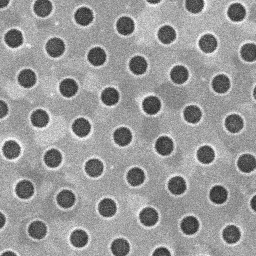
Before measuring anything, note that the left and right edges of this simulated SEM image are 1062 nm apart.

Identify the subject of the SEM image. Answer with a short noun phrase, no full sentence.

a regular array of holes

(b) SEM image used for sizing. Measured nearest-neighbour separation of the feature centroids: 174 nanometres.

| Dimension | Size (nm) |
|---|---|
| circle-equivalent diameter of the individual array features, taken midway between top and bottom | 83.6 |